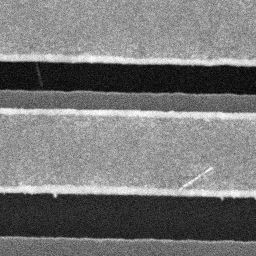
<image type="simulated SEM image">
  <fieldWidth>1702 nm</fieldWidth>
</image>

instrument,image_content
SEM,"lines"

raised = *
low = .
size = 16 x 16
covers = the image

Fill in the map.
****************
****************
****************
****************
................
................
****************
****************
****************
****************
****************
****************
................
................
................
****************